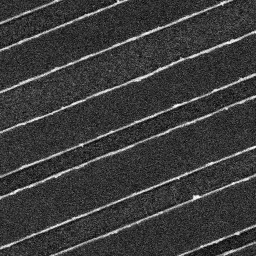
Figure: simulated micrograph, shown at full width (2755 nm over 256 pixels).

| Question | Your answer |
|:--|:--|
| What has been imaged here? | one or a few lines or trenches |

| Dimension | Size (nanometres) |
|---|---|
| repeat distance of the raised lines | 736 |